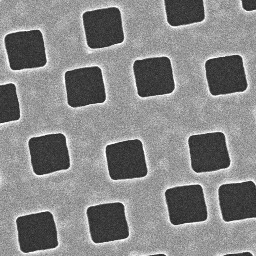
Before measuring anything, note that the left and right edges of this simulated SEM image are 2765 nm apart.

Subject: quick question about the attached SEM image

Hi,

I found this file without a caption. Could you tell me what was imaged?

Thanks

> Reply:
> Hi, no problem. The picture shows a regular array of holes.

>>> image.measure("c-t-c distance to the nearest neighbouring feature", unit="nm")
702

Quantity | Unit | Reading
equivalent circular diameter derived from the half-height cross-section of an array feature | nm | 458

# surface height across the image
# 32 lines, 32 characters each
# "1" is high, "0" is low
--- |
11111111111111111111100001111100
11111111111000011111100000111111
11111111110000011111100001111111
11111111110000011111111111111111
10000111111000001111111111111111
10000011111000011111111111111111
10000011111111111111111111111111
10000011111111111000011111000011
10001111110011111000001111000011
11111111000001111000001111000001
11111111000001111000001111000001
00111111000001111000011111000011
00111111000001111111111111111111
00111111111111111111111111111111
00111111111111111111111111111111
11111111111111111111111111111111
11111111111111111111111111111111
11110000111111110111111100001111
11110000111110000011111100001111
11110000011110000011111100000111
11110000011110000011111100000111
11110001111111000011111110111111
11111111111111111111111111111111
11111111111111111111100001100000
11111111111111111111100000100000
11111111111110011111100000100000
11111111111000001111100000110000
11000001111000001111100000110011
11000001111000001111111111111111
11000001111000001111111111111111
11000001111111111111111111111111
11101111111111111111111111111101